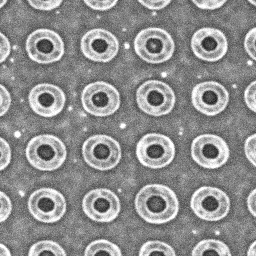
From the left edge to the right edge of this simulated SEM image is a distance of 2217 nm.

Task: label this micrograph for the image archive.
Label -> a regular array of ring-shaped raised bodies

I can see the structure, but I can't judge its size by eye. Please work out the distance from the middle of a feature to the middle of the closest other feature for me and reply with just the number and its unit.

459 nm